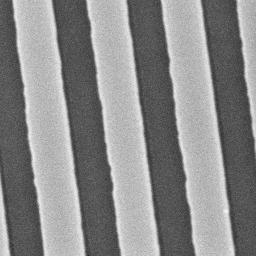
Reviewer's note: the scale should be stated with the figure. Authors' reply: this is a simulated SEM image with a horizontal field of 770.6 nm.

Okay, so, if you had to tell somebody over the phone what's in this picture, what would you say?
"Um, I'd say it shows lines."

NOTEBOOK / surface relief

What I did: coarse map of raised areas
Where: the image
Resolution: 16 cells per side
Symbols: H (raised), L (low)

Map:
LHHLLHHHLLHHHLLH
LHHLLLHHLLHHHLLH
LHHHLLHHLLHHHLLH
LHHHLLHHLLLHHLLH
LHHHLLHHLLLHHLLH
LHHHLLHHHLLHHLLH
LLHHLLHHHLLHHLLL
LLHHLLHHHLLHHHLL
LLHHLLLHHLLHHHLL
LLHHLLLHHLLHHHLL
LLHHHLLHHLLLHHLL
LLHHHLLHHLLLHHLL
LLHHHLLHHLLLHHLL
LLHHHLLHHHLLHHLL
LLLHHLLHHHLLHHLL
HLLHHLLHHHLLHHHL